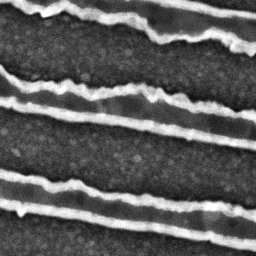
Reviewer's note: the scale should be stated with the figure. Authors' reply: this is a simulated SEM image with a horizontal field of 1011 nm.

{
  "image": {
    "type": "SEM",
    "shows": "one or a few lines or trenches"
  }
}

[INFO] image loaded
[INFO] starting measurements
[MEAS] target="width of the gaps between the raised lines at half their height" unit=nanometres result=271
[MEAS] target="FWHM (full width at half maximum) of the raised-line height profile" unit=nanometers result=124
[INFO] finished